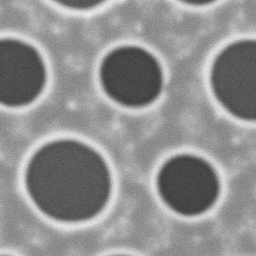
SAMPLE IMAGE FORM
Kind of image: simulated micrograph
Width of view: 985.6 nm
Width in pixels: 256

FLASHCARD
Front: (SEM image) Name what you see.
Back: holes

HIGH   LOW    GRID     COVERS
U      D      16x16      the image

UUUUDDUUUUUUUUUU
UUUUUUUUUUUUUUUU
DUUUUUUUUUUUUUUD
DDDUUUUDDDUUUDDD
DDDUUUDDDDUUUDDD
DDDUUUDDDDUUUDDD
DDUUUUUDDUUUUUDD
UUUUUUUUUUUUUUUD
UUUUUUUUUUUUUUUU
UUDDDDUUUUUUUUUU
UUDDDDDUUUDDDUUU
UUDDDDDUUUDDDDUU
UUDDDDDUUUDDDDUU
UUUDDDUUUUUUUUUU
UUUUUUUUUUUUUUUU
UUUUUUUUUUUUUUUU